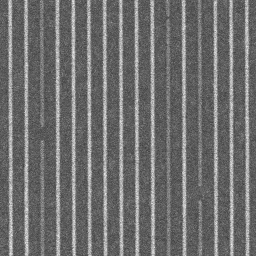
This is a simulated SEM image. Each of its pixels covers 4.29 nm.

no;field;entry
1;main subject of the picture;parallel lines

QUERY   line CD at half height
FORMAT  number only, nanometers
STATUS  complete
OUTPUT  13.4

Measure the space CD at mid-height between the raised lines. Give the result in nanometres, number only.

55.3